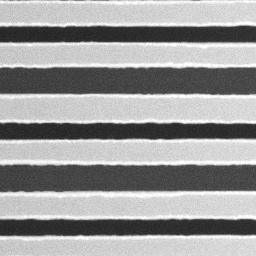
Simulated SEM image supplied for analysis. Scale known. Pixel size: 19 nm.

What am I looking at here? lines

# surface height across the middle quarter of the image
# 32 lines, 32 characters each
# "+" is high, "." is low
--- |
++++++++++++++++++++++++++++++++
................................
................................
................................
................................
................................
................................
................................
++++++++++++++++++++++++++++++++
++++++++++++++++++++++++++++++++
++++++++++++++++++++++++++++++++
++++++++++++++++++++++++++++++++
++++++++++++++++++++++++++++++++
++++++++++++++++++++++++++++++++
++++++++++++++++++++++++++++++++
................................
................................
................................
................................
++++++++++++++++++++++++++++++++
++++++++++++++++++++++++++++++++
++++++++++++++++++++++++++++++++
++++++++++++++++++++++++++++++++
++++++++++++++++++++++++++++++++
++++++++++++++++++++++++++++++++
................................
................................
................................
................................
................................
................................
................................